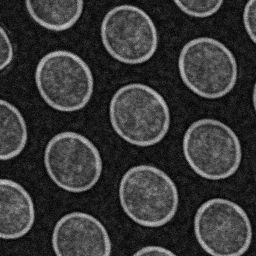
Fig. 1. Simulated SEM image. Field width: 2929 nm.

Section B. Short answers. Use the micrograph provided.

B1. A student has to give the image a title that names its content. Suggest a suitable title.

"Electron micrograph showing raised bodies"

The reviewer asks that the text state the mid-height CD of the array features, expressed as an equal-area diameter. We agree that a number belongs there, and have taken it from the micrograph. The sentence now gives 631 nm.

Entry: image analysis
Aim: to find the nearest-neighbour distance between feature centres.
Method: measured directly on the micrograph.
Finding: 914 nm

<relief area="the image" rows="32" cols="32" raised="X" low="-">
----XXXXXX------------XXXXX----X
----XXXXXX----XXXX------XX-----X
-----XXXX----XXXXXX------------X
-------------XXXXXX------------X
X------------XXXXXX-------------
X------------XXXXXX-----XXX-----
X-------------XXXXX----XXXXX----
X----XXXXX-----XXX-----XXXXXX---
-----XXXXXX------------XXXXXX---
-----XXXXXX------------XXXXXX---
-----XXXXXX-------------XXXXX---
-----XXXXXX----XXXX------XXX----
------XXXXX---XXXXXX------------
X------XXX----XXXXXXX-----------
XX------------XXXXXXX-----------
XXX-----------XXXXXXX----XXX----
XXX------------XXXXX----XXXXX---
XXX----XXX------XXX----XXXXXX---
XXX---XXXXXX-----------XXXXXXX--
X-----XXXXXX-----------XXXXXXX--
------XXXXXX------------XXXXXX--
------XXXXXX----XXXX-----XXXX---
-------XXXXX----XXXXX-----------
XXX-----XXX----XXXXXXX----------
XXX------------XXXXXXX----------
XXXX-----------XXXXXXX----XXX---
XXXX------------XXXXXX---XXXXX--
XXXX----XXXX-----XXXX----XXXXXX-
XXX----XXXXXX------------XXXXXX-
XX-----XXXXXX------------XXXXXX-
-------XXXXXXX-----------XXXXXX-
-------XXXXXXX----XXX-----XXXX--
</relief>